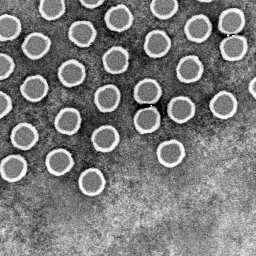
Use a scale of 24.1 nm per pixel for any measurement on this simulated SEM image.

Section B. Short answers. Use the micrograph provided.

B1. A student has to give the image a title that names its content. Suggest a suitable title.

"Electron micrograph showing a regular array of raised bodies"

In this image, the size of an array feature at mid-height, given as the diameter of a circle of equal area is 0.585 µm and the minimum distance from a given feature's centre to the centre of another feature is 960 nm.